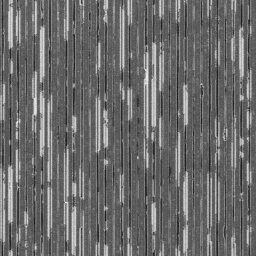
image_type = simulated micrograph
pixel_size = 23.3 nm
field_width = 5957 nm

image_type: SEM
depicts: parallel lines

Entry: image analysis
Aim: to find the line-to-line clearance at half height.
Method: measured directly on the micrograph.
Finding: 43.6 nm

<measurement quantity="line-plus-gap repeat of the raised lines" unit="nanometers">185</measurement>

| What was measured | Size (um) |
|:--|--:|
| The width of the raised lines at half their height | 0.157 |